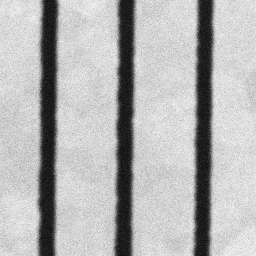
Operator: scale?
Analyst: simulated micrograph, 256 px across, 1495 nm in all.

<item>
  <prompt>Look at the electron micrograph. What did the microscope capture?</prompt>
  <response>lines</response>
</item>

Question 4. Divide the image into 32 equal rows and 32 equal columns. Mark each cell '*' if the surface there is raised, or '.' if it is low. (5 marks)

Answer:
*****..********..********..*****
*****..********..********..*****
*****..********..********..*****
*****..********..********..*****
*****..********..*******...*****
*****..********..********..*****
*****..********..*******...*****
*****..********..********..*****
*****..********..*******...*****
*****..********..*******...*****
*****..********..*******...*****
*****..********..*******...*****
*****..********..*******...*****
*****..********..*******...*****
*****..********..*******...*****
*****..********..*******..******
*****..********..*******...*****
*****..********..*******...*****
*****..********..*******...*****
*****..********..*******..******
*****..********..*******...*****
*****..********..*******..******
*****..*******...*******..******
*****..*******...*******..******
*****..********..*******..******
*****..********..*******..******
*****..*******...*******..******
*****..*******...*******..******
*****..*******...*******..******
*****..*******...*******..******
*****..*******...*******..******
*****..*******...*******..******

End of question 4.